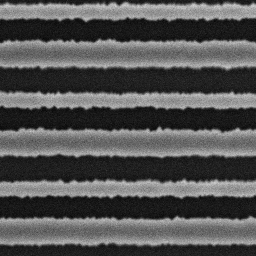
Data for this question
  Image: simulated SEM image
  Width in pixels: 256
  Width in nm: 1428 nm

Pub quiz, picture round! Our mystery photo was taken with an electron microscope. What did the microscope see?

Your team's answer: lines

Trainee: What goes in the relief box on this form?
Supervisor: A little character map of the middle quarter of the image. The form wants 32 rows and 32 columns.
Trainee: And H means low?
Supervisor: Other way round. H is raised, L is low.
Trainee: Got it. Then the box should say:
HHLHHHHHHHHHHHHHHHHHHHHHHHHHHHHH
LLLLLLLLLLLLLLLLLLLLLLLLLLLLLLLL
LLLLLLLLLLLLLLLLLLLLLLLLLLLLLLLL
LLLLLLLLLLLLLLLLLLLLLLLLLLLLLLLL
LLLLLLLLLLLLLLLLLLLLLLLLLLLLLLLL
LLLLLLLLLLLLLLLLLLLLLLLLLLLLLLLL
LLLLLLLLLLLLLLLLLLLLLLLLLLLLLLLL
HHHHHHHHHHHHLLLHHHHLHHHHHHHHHHHL
HHHHHHHHHHHHHHHHHHHHHHHHHHHHHHHH
HHHHHHHHHHHHHHHHHHHHHHHHHHHHHHHH
HHHHHHHHHHHHHHHHHHHHHHHHHHHHHHHH
LLLLLLLLLLLLLLLLLLLLLLLLLLLLLLLL
LLLLLLLLLLLLLLLLLLLLLLLLLLLLLLLL
LLLLLLLLLLLLLLLLLLLLLLLLLLLLLLLL
LLLLLLLLLLLLLLLLLLLLLLLLLLLLLLLL
LLLLLLLLLLLLLLLLLLLLLLLLLLLLLLLL
LHLLLLLLLLLLLLLLLLLLLLLHLHHLLLLL
HHHHHHHHHHHHHHHHHHHHHHHHHHHHHHHH
HHHHHHHHHHHHHHHHHHHHHHHHHHHHHHHH
HHHHHHHHHHHHHHHHHHHHHHHHHHHHHHHH
HHHHHHHHHHHHHHHHHHHHHHHHHHHHHHHH
HHHHHHHHHHHHHHHHHHHHHHHHHHHHHHHH
HHHHHHHHHHHHHHHHHHHHHHHHHHHHHHHH
LLLLLLLLLLLLLLLLLLLLLLLLLLLLLLLL
LLLLLLLLLLLLLLLLLLLLLLLLLLLLLLLL
LLLLLLLLLLLLLLLLLLLLLLLLLLLLLLLL
LLLLLLLLLLLLLLLLLLLLLLLLLLLLLLLL
LLLLLLLLLLLLLLLLLLLLLLLLLLLLLLLL
LLLLLLLLLLLLLLLLLLLLLLLLLLLLLLLL
LHHLLHLHHHHHHHHHHLHHHHHHLLHLHHHH
HHHHHHHHHHHHHHHHHHHHHHHHHHHHHHHH
HHHHHHHHHHHHHHHHHHHHHHHHHHHHHHHH